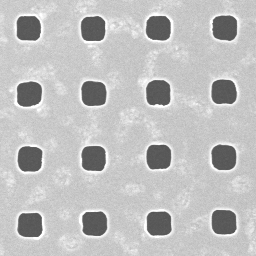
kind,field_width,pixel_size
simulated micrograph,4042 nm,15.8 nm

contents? a regular array of holes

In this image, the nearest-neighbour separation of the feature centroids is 1010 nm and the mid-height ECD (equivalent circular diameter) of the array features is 0.422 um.